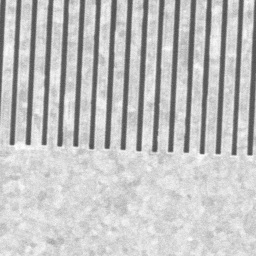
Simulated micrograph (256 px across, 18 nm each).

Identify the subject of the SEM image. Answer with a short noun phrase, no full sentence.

parallel lines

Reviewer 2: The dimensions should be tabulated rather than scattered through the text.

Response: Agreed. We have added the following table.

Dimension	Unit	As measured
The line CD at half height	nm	164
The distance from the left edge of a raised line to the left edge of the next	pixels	15.9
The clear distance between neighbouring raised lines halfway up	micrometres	0.114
